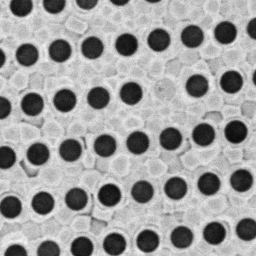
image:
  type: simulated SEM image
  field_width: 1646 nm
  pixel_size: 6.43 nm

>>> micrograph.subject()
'a regular array of holes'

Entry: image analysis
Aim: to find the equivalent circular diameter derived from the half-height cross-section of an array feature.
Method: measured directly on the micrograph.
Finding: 153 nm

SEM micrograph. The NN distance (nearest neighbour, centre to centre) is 212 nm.